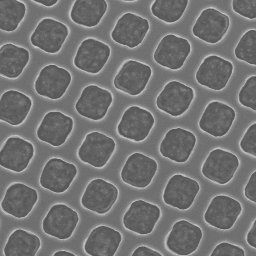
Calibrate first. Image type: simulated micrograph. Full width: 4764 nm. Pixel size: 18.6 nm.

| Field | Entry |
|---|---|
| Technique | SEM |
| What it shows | a regular array of holes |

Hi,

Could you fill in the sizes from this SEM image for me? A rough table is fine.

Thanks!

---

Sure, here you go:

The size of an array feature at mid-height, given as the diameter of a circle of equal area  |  0.634 microns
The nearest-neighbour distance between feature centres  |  46.4 pixels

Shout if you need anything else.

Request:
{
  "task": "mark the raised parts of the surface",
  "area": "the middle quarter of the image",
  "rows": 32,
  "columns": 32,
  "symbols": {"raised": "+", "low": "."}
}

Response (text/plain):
+++.......+++++......++++.....++
+++++....+++++........++++++++++
.++++++++++++.........++++++++++
..+++++++++++........+++++++++++
..++++++++++.........+++++..++++
.+++++..+++++.......+++++......+
+++++.....++++......+++++.......
++++........++++...+++++........
++++........+++++++++++.........
+++.........+++++++++++.........
+++........++++++++++++........+
+++........+++++....++++.......+
++++......+++++.......++++....++
..++++....++++........++++++++++
..++++++++++++........++++++++++
..++++++++++++........++++++++++
..+++++++++++.........+++++...++
.+++++....++++.......+++++......
.++++.......+++.....+++++.......
+++++........+++++++++++........
++++.........+++++++++++........
++++.........+++++++++++........
++++........+++++..+++++........
++++.......+++++......++++.....+
+++++......++++........+++++..++
...++++...+++++........+++++++++
...+++++++++++.........+++++++++
...+++++++++++.........+++++++++
...+++++++++++........+++++....+
..+++++....++++.......++++......
.+++++.......++++....+++++......
+++++........++++++++++++.......